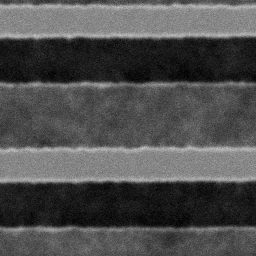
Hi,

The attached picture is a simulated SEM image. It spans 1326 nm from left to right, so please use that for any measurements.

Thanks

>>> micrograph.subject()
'lines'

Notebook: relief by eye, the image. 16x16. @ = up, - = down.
@@@@@@@@@@@@@@@@
@@@@@@@@@@@@@@@@
----------------
----------------
----------------
@@@@@@@@@@@@@@@@
@@@@@@@@@@@@@@@@
@@@@@@@@@@@@@@@@
@@@@@@@@@@@@@@@@
@@@@@@@@@@@@@@@@
@@@@@@@@@@@@@@@@
----------------
----------------
----------------
@@@@@@@@@@@@@@@@
@@@@@@@@@@@@@@@@